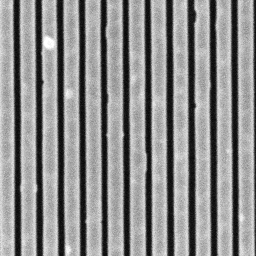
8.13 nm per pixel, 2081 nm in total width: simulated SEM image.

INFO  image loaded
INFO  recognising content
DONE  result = parallel lines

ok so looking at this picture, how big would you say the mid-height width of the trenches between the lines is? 0.0579 µm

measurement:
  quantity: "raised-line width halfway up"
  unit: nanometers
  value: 122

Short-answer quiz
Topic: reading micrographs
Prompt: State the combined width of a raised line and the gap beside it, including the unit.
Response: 177 nm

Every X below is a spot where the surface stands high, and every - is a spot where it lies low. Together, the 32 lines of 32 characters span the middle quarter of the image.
XXXX-XXXX--XXXX--XXX--XXX---XXX-
XXXX-XXXX--XXXX--XXX--XXX---XXX-
XXX--XXXX--XXXX--XXX--XXX---XXX-
XXX---XXX--XXXX--XXX--XXX---XXX-
XXX---XXX--XXXX--XXX--XXX---XXX-
XXX---XXX--XXXX--XXX--XXX---XXX-
XXXX--XXX--XXXX--XXX--XXX---XXX-
XXXX--XXX--XXXX--XXX--XXX--XXXX-
XXXX--XXX--XXXX--XXX--XXX--XXXX-
XXXX--XXX--XXXX--XXX--XXX--XXXX-
XXXX--XXX--XXXX--XXX--XXX--XXXX-
XXXX--XXX--XXXX--XXX--XXX--XXXX-
XXXX--XXX--XXXX--XXX--XXX--XXXX-
XXXX--XXX--XXXX--XXX--XXX--XXXX-
XXXX--XXX--XXXX--XXX--XXX--XXXX-
XXXX--XXX--XXXX--XXX--XXX--XXXX-
XXXX--XXX--XXXX--XXX--XXX--XXXX-
XXXX--XXX--XXXX--XXX--XXX---XXX-
XXXX--XXX--XXXX--XXX--XXX---XXX-
XXXX--XXX--XXXX--XXX--XXX---XXX-
XXXX--XXX--XXXX--XXX--XXX---XXX-
XXXX--XXX--XXXX--XXX--XXXX--XXX-
XXXX--XXX--XXXX--XXX--XXXX--XXX-
XXXX--XXX--XXXX--XXX--XXXX--XXX-
XXXX--XXX--XXXX--XXX--XXXX--XXX-
XXXX--XXX--XXXX--XXX--XXXX--XXX-
XXXX--XXX--XXXX--XXX--XXXX--XXX-
XXXX--XXX--XXXX--XXX--XXXX--XXX-
XXXX--XXX--XXXX--XXX--XXXX--XXX-
XXXX--XXX--XXXX--XXX--XXXX--XXX-
XXXX--XXX--XXXX--XXX--XXXX--XXX-
XXXX--XXX--XXXX--XXX--XXXX--XXX-